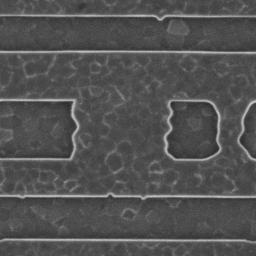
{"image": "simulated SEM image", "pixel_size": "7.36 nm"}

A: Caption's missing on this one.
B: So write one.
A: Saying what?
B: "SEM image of one or a few lines or trenches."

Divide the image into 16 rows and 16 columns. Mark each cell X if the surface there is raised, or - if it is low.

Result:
XXXXXXXXXXXXXXXX
----------------
----------------
XXXXXXXXXXXXXXXX
XXXXXXXXXXXXXXXX
XXXXXXXXXXXXXXXX
----XXXXXXX--XXX
-----XXXXXX---X-
-----XXXXX----X-
-----XXXXXX---X-
XXXXXXXXXXXXXXXX
XXXXXXXXXXXXXXXX
----------------
----------------
----------------
XXXXXXXXXXXXXXXX